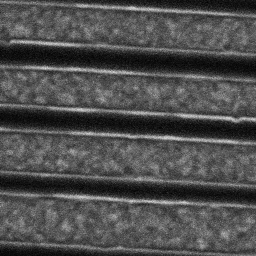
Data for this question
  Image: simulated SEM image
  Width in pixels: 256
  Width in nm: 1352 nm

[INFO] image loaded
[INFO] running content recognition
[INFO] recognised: one or a few lines or trenches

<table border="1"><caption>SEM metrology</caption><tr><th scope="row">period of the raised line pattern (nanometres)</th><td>340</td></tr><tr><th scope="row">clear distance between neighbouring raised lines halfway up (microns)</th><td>0.202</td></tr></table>